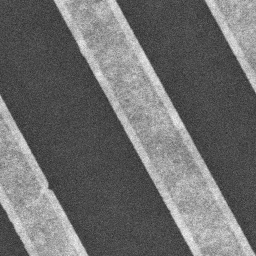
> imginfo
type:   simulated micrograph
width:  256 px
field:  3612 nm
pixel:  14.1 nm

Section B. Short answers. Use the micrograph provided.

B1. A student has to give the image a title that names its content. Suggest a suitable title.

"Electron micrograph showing one or a few lines or trenches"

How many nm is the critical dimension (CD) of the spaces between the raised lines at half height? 1420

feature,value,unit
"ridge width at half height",644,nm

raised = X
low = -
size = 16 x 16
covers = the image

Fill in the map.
----XXX------XXX
----XXXX------XX
-----XXX------XX
------XXX------X
------XXX-------
-------XXX------
-------XXX------
X-------XXX-----
X-------XXXX----
XX-------XXX----
XX-------XXXX---
XXX-------XXX---
XXX--------XXX--
-XXX-------XXX--
-XXX--------XXX-
--XXX-------XXX-